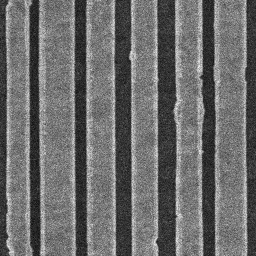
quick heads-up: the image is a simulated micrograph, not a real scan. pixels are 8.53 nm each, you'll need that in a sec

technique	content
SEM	parallel lines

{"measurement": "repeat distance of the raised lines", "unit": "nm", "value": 362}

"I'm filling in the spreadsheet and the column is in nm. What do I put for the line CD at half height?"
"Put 226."